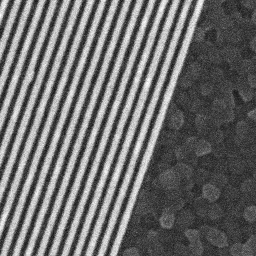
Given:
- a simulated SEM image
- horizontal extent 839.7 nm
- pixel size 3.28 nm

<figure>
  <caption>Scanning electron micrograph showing parallel lines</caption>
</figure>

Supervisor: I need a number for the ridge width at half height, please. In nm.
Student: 19.4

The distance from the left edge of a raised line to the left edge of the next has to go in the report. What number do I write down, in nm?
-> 37.8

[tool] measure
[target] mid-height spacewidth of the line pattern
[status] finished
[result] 19.4 nm